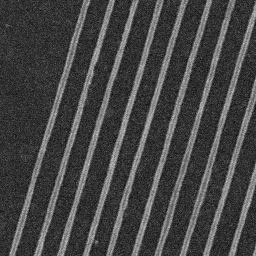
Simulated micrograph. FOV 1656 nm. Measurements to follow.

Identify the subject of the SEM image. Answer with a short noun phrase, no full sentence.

parallel lines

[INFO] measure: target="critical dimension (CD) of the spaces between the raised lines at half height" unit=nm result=128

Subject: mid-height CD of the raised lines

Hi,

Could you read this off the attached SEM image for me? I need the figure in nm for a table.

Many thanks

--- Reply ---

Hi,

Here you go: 27.2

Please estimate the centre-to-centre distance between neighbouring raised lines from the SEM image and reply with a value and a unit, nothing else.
0.151 µm